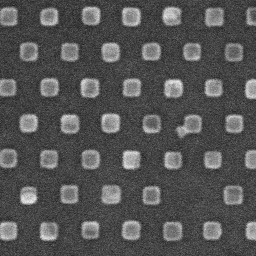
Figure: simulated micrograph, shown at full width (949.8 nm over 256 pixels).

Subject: a regular array of raised bodies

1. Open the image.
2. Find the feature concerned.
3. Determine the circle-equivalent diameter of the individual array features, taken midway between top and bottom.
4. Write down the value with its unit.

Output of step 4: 66.9 nanometres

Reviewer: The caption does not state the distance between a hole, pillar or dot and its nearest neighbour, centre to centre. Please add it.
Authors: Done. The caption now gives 0.15 micrometres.